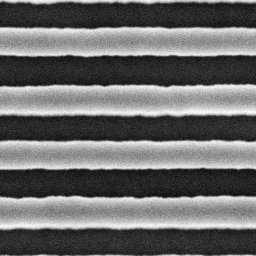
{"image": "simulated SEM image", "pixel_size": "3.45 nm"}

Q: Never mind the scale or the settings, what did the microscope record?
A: lines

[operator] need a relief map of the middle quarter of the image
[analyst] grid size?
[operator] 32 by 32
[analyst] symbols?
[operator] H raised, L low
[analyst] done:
LLLLLLLLLLLLLLLLLLLLLLLLLLLLLLLL
LLLLLLLLLLLLLLLLLLLLLLLLLLLLLLLL
LLLLLLLLLLLLLLLLLLLLLLLLLLLLLLLL
LLLLLLLLLLLLLLLLLLLLLLLLLLLLLLLL
LLLLLLLLLLLLLLLLLLLLLLLLLLLLLLLL
HHHLLLLHHLLHHHLHHHHHHHHLLLLLLLLL
HHHHHHHHHHHHHHHHHHHHHHHHHHHHHHHH
HHHHHHHHHHHHHHHHHHHHHHHHHHHHHHHH
HHHHHHHHHHHHHHHHHHHHHHHHHHHHHHHH
HHHHHHHHHHHHHHHHHHHHHHHHHHHHHHHH
HHHHHHHHHHHHHHHHHHHHHHHHHHHHHHHH
HHHHHHHHHHHHHHHHHHHHHHHHHHHHHHHH
LLLLLLLLLLLLLLHHHHLHHHHHLLLHHHLL
LLLLLLLLLLLLLLLLLLLLLLLLLLLLLLLL
LLLLLLLLLLLLLLLLLLLLLLLLLLLLLLLL
LLLLLLLLLLLLLLLLLLLLLLLLLLLLLLLL
LLLLLLLLLLLLLLLLLLLLLLLLLLLLLLLL
LLLLLLLLLLLLLLLLLLLLLLLLLLLLLLLL
LLLLLLLLLLLLLLLLLLLLLLLLLLLLLLLL
LLHHHHHHLHHHLLLLHHLHHHLLLLLHHHHH
HHHHHHHHHHHHHHHHHHHHHHHHHHHHHHHH
HHHHHHHHHHHHHHHHHHHHHHHHHHHHHHHH
HHHHHHHHHHHHHHHHHHHHHHHHHHHHHHHH
HHHHHHHHHHHHHHHHHHHHHHHHHHHHHHHH
HHHHHHHHHHHHHHHHHHHHHHHHHHHHHHHH
HHHHHHHHHHHHHHHHHHHHHHHHHHHHHHHH
LLLLLLLLLLLLLLLLLLLLLLLLLLLLLLLL
LLLLLLLLLLLLLLLLLLLLLLLLLLLLLLLL
LLLLLLLLLLLLLLLLLLLLLLLLLLLLLLLL
LLLLLLLLLLLLLLLLLLLLLLLLLLLLLLLL
LLLLLLLLLLLLLLLLLLLLLLLLLLLLLLLL
LLLLLLLLLLLLLLLLLLLLLLLLLLLLLLLL